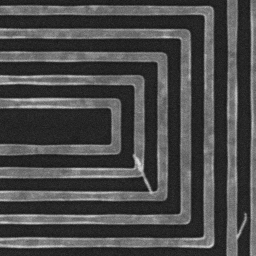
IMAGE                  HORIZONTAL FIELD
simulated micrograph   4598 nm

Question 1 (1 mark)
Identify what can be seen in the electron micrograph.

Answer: groups of lines, slits or small figures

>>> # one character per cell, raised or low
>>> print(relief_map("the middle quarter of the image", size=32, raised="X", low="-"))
------------------------XX---XX-
------------------------XX---XX-
------------------------XX---XX-
XXXXXXXXXXXXXXXXXXXX----XX---XX-
XXXXXXXXXXXXXXXXXXXX----XX---XX-
------------------XX----XX---XX-
------------------XX----XX---XXX
------------------XX----XX---XXX
------------------XX----XX---XXX
XXXXXXXXXXXXXX----XX----XX---XXX
XXXXXXXXXXXXXX----XX----XX---XXX
------------XX----XX----XX---XXX
------------XX----XX----XX---XXX
------------XX----XX----XX---XX-
------------XX----XX----XX---XX-
------------XX----XX----XX---XX-
------------XX----XX----XX---XX-
------------XX----XX----XX---XX-
------------XX----XX----XX---XXX
------------XX----XX----XX---XXX
XXXXXXXXXXXXXX----XX----XX---XXX
XXXXXXXXXXXXXX----XX----XX---XXX
------------------XX----XX---XXX
------------------XX----XX---XXX
------------------XX----XX---XXX
------------------XX----XX---XX-
XXXXXXXXXXXXXXXXXXXX----XX---XX-
XXXXXXXXXXXXXXXXXXXX----XX---XX-
------------------------XX---XX-
------------------------XX---XX-
------------------------XX---XX-
-----------------------XXX---XX-